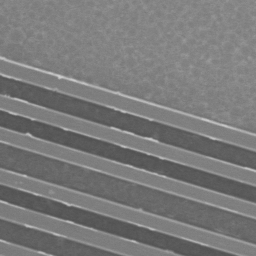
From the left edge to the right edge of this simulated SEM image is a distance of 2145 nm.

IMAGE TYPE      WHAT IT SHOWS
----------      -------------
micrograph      parallel lines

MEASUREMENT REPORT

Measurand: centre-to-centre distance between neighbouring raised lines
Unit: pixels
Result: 34.5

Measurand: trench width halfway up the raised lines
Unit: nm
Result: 148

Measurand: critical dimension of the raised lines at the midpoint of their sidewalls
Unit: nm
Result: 124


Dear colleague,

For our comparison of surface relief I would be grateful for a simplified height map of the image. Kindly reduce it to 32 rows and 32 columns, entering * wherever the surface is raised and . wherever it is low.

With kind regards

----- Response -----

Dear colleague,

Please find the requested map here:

................................
................................
................................
................................
................................
................................
................................
*...............................
****............................
********........................
....*******.....................
.......********.................
***........*******..............
******........*******...........
...******........*******........
......******.........*******....
**.......*******........*******.
*****........******........*****
..*******.......******.........*
......******.......*******......
.........******........******...
**..........*******.......******
*****...........******.......***
..******...........******.......
.....*******..........*******...
*.......*******...........******
****........******...........***
.*******.......*******..........
....*******.......*******.......
.......*******........******....
**.........*******.......******.
*****.........*******.......****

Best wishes